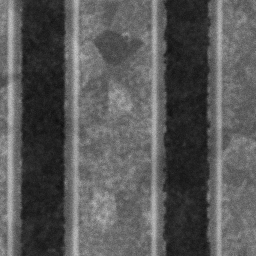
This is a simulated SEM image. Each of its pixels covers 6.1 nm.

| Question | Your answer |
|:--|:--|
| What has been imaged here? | one or a few lines or trenches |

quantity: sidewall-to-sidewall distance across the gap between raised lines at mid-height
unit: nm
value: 399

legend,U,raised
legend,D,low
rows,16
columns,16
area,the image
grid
UDDDDUUUUUDDDDUU
UDDDDUUUUUDDDDUU
UDDDDUUUUUDDDDUU
UDDDDUUUUUDDDDUU
UDDDDUUUUUDDDDUU
UDDDDUUUUUDDDDUU
UDDDDUUUUUDDDDUU
UDDDDUUUUUDDDDUU
UDDDDUUUUUDDDDUU
UDDDDUUUUUDDDDUU
UDDDDUUUUUDDDDUU
UDDDDUUUUUDDDDUU
UDDDDUUUUUDDDDUU
UDDDDUUUUUDDDDUU
UDDDDUUUUUDDDDUU
UDDDDUUUUUDDDDUU